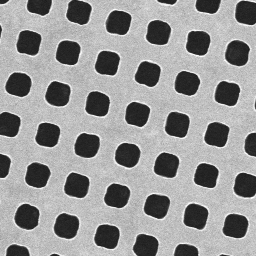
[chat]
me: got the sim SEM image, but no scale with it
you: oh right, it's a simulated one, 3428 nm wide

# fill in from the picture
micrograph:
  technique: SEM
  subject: a regular array of holes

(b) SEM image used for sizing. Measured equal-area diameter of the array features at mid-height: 0.338 microns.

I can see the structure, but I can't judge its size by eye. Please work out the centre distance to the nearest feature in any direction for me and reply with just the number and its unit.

544 nm